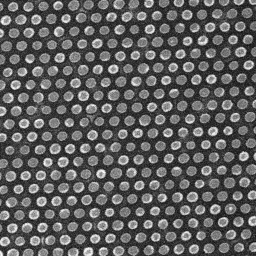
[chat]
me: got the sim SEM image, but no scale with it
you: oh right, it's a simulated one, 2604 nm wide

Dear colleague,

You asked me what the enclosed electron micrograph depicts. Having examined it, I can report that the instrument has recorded a regular array of raised bodies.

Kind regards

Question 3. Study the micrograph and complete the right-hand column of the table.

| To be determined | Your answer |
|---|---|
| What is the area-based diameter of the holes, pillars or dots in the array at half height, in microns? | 0.0967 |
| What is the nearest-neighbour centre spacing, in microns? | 0.15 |